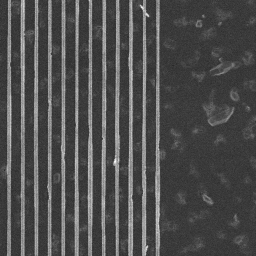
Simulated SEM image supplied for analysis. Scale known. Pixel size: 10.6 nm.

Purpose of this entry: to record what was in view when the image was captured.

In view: parallel lines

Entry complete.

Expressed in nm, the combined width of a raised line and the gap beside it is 143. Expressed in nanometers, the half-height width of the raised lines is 30.4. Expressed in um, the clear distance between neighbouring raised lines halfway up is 0.115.